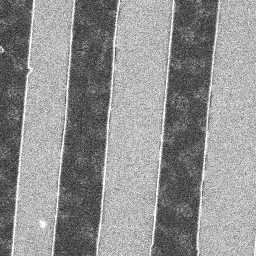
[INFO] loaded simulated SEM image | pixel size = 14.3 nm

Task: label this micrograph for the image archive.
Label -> one or a few lines or trenches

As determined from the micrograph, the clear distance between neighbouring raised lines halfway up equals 747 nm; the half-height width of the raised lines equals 645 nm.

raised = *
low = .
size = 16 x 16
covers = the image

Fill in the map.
**...**....***..
**..***....***..
**..***....**...
**..***....**...
**..***...***...
**..***...***...
**..***...***...
*...***...***...
*...***...***...
*...***...***...
*...**....***...
*...***...***...
*...**....***...
*..***....**....
*..***....**....
*..***...***....